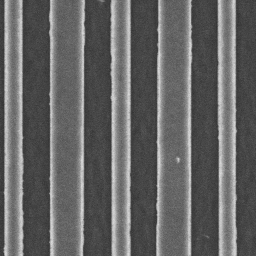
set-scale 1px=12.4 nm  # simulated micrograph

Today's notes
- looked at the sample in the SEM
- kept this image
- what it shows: lines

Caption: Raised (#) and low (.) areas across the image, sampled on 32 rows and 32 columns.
.##...#####...##....####...##...
.##...#####...##....####...##...
.##...#####...##....####...##...
.##...####....##....####...##...
.##...####....##....####...##...
.##...####....##....####...##...
.##...####....##....####...##...
.##...####....##....####...##...
.##...####....##....####...##...
.##...####....##....####...##...
.##...####....##....####...##...
.##...####....##....####...##...
.##...####....##....####...##...
.##...####....##....####...##...
.##...####....##....####...##...
.##...####....##....####...##...
.##...####....##....####...##...
.##...####....##....####...##...
.##...####....##....####...##...
.##...####....##....####...##...
.##...####....##....####...##...
.##...####....##....####...##...
.##...####....##....####...##...
.##...####....##....####...##...
.##...####....##....####...##...
.##...####....##....####...##...
.##...####....##....####...##...
.##...####....##....####...##...
.##...####....##....####...##...
.##...####....##....####...##...
.##...####....##....####...##...
.##...####....##....####...###..